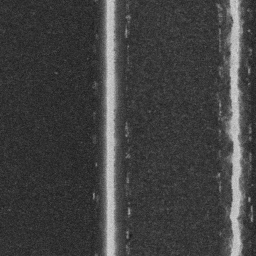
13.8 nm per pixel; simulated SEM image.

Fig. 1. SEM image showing one or a few lines or trenches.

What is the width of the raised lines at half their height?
1.71 um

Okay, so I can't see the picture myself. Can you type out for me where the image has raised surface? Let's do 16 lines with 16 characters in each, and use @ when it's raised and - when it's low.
-------@@@@@@@@-
-------@@@@@@@@-
-------@@@@@@@@-
-------@@@@@@@@-
-------@@@@@@@@-
-------@@@@@@@@-
-------@@@@@@@@-
-------@@@@@@@@-
-------@@@@@@@@-
-------@@@@@@@@-
-------@@@@@@@@-
-------@@@@@@@@-
-------@@@@@@@@-
-------@@@@@@@@-
-------@@@@@@@@-
-------@@@@@@@@-